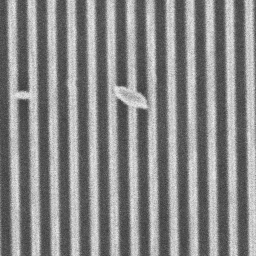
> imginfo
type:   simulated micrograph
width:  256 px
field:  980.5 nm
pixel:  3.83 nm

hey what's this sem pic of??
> parallel lines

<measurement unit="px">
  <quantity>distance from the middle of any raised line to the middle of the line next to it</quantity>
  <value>19.8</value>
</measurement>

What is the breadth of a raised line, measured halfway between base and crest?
33 nm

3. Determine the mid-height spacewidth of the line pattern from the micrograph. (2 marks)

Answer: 40.7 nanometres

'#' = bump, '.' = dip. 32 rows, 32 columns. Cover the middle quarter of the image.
.##...##...##...##...##...##...#
.##...##...##...##...##...##...#
.##...##...##...##...##...##...#
.##...##...##...##...##...##...#
.##...##...##...##...##...##...#
.##...##...##...##...##...##...#
.##...##...#######...##...##...#
.##...##...########..##...##...#
.##...##...#########.##...##...#
.##...##...##..########...##...#
.##...##...##...#######...##...#
.##...##...##...##...##...##...#
.##...##...##...##...##...##...#
.##...##...##...##...##...##...#
.##...##...##...##...##...##...#
.##...##...##...##...##...##...#
.##...##...##...##...##...##...#
.##...##...##...##...##...##...#
.##...##...##...##...##...##...#
.##...##...##...##...##...##...#
.##...##...##...##...##...##...#
.##...##...##...##...##...##...#
.##...##...##...##...##...##...#
..#...##...##...##...##...##...#
..#...##...##...##...##...##...#
..#...##...##...##...##...##...#
..#...##...##...##...##...##...#
..#...##...##...##...##...##...#
..##..##...##...##...##...##...#
..##..###..##...##...##...##...#
..##..###..##...##...##...##...#
..##..###..##....#...##...##...#